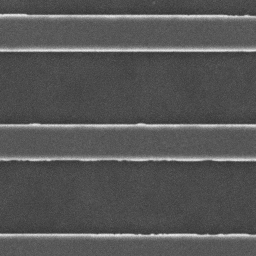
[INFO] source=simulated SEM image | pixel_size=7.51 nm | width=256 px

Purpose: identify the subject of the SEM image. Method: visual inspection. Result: lines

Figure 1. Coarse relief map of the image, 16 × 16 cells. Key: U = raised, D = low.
DDDDDDDDDDDDDDDD
UUUUUUUUUUUUUUUU
UUUUUUUUUUUUUUUU
DDDDDDDDDDDDDDDD
DDDDDDDDDDDDDDDD
DDDDDDDDDDDDDDDD
DDDDDDDDDDDDDDDD
DDDDDDDDDDDDDDDD
UUUUUUUUUUUUUUUU
UUUUUUUUUUUUUUUU
DDDDDDDDDDDDDDDD
DDDDDDDDDDDDDDDD
DDDDDDDDDDDDDDDD
DDDDDDDDDDDDDDDD
DDDDDDDDDDDDDDDD
UUUUUUUUUUUUUUUU